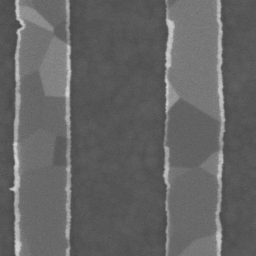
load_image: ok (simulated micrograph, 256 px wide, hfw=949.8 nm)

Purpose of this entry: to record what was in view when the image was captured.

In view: one or a few lines or trenches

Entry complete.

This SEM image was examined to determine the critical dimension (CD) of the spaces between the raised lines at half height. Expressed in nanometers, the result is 360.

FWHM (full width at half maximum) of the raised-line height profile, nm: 204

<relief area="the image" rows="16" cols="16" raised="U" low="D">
DUUUDDDDDDUUUUDD
DUUUDDDDDDUUUUDD
DUUUDDDDDDUUUUDD
DUUUDDDDDDUUUUDD
DUUUDDDDDDUUUUDD
DUUUDDDDDDUUUUDD
DUUUDDDDDDUUUUDD
DUUUDDDDDDUUUUDD
DUUUDDDDDDUUUUDD
DUUUDDDDDDUUUUDD
DUUUDDDDDDUUUUDD
DUUUDDDDDDUUUUDD
DUUUDDDDDDUUUUDD
DUUUDDDDDDUUUUDD
DUUUDDDDDDUUUUDD
DUUUDDDDDDUUUUDD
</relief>